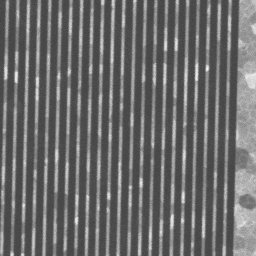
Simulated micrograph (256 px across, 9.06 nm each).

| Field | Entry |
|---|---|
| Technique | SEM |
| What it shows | parallel lines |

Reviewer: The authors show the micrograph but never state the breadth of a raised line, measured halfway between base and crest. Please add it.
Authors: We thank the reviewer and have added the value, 23.8 nanometres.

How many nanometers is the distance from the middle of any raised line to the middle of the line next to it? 96.1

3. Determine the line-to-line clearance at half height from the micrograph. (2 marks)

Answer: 75.8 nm